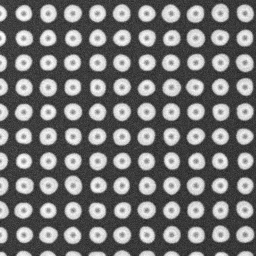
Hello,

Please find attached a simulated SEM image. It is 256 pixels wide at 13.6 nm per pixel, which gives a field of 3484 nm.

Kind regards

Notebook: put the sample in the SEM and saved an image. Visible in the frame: an array of small figures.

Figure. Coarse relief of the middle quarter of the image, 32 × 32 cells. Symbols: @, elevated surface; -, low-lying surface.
@@@@---@@@---@@@---@@@@--@@@@--@
-@@-----@@----@@----@@----@@----
--------------------------------
--------------------------------
-@@@---@@@---@@@----@@---@@@@--@
@@@@---@@@---@@@@--@@@@--@@@@--@
@@@@---@@@---@@@---@@@@--@@@@--@
-@@----@@@---@@@---@@@---@@@----
--------------------------------
--------------------------------
-@@@---@@@---@@@---@@@---@@@----
@@@@--@@@@--@@@@@-@@@@@--@@@@--@
@@@@--@@@@--@@@@@--@@@@--@@@@--@
-@@@---@@@---@@@---@@@---@@@----
--------------------------------
--------------------------------
-@@@---@@@---@@-----@@----@@----
@@@@--@@@@--@@@@---@@@@--@@@@--@
@@@@--@@@@--@@@@--@@@@@--@@@@--@
-@@@--@@@@---@@@---@@@---@@@---@
--------------------------------
--------------------------------
--@----@@@----@@---@@@----@@----
@@@@--@@@@@--@@@@--@@@---@@@@--@
@@@@--@@@@@-@@@@@--@@@@--@@@@--@
-@@@---@@@---@@@---@@@----@@@--@
--------@-----------------------
--------------------------------
-@@@----@-----@-----@@----@@----
@@@@---@@@---@@@---@@@@--@@@@--@
@@@@---@@@@-@@@@---@@@@--@@@@--@
-@@@---@@@---@@@---@@@@--@@@@--@